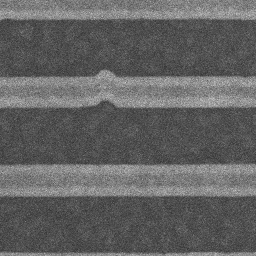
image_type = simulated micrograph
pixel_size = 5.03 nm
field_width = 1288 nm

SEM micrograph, one or a few lines or trenches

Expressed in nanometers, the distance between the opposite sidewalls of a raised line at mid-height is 108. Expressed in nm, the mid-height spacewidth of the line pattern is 336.